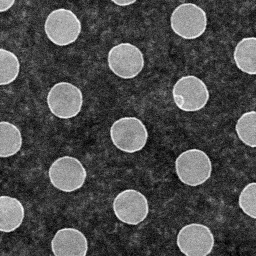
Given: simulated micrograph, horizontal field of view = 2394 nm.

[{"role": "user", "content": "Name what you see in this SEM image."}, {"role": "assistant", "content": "a regular array of raised bodies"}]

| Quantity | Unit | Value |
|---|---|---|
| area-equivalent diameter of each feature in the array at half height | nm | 324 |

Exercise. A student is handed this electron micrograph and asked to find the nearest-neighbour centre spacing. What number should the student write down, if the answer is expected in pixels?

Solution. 72.2